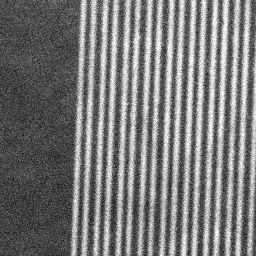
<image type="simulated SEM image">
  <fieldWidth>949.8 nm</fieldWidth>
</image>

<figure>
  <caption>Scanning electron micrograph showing parallel lines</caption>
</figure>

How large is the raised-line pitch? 40.6 nanometers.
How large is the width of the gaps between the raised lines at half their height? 28.3 nm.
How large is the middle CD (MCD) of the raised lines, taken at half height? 10.7 nm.